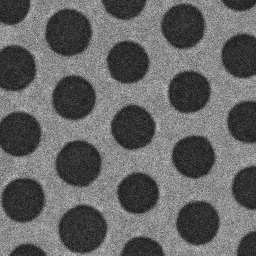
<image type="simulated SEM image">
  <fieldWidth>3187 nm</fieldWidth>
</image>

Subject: a regular array of holes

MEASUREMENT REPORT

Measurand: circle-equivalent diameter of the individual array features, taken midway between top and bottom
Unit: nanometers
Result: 554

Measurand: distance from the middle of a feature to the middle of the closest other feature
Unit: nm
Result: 814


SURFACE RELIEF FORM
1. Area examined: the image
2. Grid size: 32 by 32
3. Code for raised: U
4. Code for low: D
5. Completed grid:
DDDDUUUUUUUUUDDDDDUUUUUDUUUUDDDD
DDDDUUUDDDUUUDDDDDUUUDDDDUUUUUUU
DDDUUUDDDDDUUUUDUUUUDDDDDDUUUUUU
UUUUUUDDDDDUUUUUUUUUDDDDDDUUUUUU
UUUUUUDDDDDUUUUUUUUUDDDDDUUUUDDD
UUUUUUDDDDDUUUUDDUUUUDDDDUUUDDDD
DDDDUUUDDDUUUUDDDDUUUUUUUUUUDDDD
DDDDUUUUUUUUUDDDDDDUUUUUUUUUDDDD
DDDDDUUUUUUUUDDDDDDUUUUUUUUUDDDD
DDDDUUUUDDUUUUDDDDUUUUDDDUUUUDDD
DDDDUUUDDDDUUUUUUUUUUDDDDDUUUUUU
UUUUUUUDDDDDUUUUUUUUUDDDDDUUUUUU
UUUUUUDDDDDDUUUUUUUUUDDDDDUUUUUU
UUUUUUUDDDDDUUUDDDUUUUDDDUUUUDDD
UDDDUUUUDDDUUUDDDDDUUUUUUUUUDDDD
DDDDDUUUUUUUUUDDDDDUUUUUUUUUDDDD
DDDDDUUUUUUUUUDDDDDUUUUUUUUUUDDD
DDDDDUUUUUUUUUDDDDDUUUUDDDUUUUDD
DDDDDUUUDDDDUUUDDDUUUUDDDDDUUUUU
UUDUUUUDDDDDDUUUUUUUUDDDDDDUUUUU
UUUUUUUDDDDDDUUUUUUUUUDDDDDUUUUU
UUUUUUUDDDDDDUUUUUUUUUDDDDUUUUDD
UUDDUUUUDDDDUUUDDDDUUUUUUUUUUDDD
UDDDDUUUUUUUUUUDDDDDUUUUUUUUUDDD
DDDDDDUUUUUUUUUDDDDDUUUUUUUUUDDD
DDDDDDUUUUUUUUUDDDDUUUUDDDUUUUDD
UDDDDUUUDDDDUUUUDDUUUUDDDDDUUUUU
UUDDUUUUDDDDDUUUUUUUUUDDDDDUUUUU
UUUUUUUDDDDDDUUUUUUUUUDDDDDUUUUU
UUUUUUUDDDDDDUUUUUUUUUUDDDDUUUUD
UUUDUUUUDDDDDUUUDDDDUUUUDUUUUUDD
UDDDDDUUUDDUUUUDDDDDUUUUUUUUUUDD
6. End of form